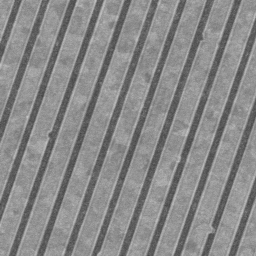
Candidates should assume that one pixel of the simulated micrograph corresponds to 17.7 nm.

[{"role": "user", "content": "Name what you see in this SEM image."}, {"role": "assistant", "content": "parallel lines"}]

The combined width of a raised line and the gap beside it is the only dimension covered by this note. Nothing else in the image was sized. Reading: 458 nm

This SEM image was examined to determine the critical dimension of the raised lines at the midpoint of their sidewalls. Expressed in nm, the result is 309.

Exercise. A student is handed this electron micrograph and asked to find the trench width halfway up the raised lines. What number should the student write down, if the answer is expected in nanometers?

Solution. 154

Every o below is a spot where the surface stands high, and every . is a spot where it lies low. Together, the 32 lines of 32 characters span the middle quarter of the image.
oo...oooo..ooooo..ooooo..ooooo..
oo..ooooo..ooooo..ooooo..oooo...
oo..oooo...oooo...oooo..ooooo..o
o...oooo..ooooo..ooooo..ooooo..o
o..ooooo..ooooo..ooooo..oooo...o
o..oooo...oooo...oooo..ooooo..oo
...oooo..ooooo..ooooo..ooooo..oo
..ooooo..ooooo..ooooo..oooo...oo
..oooo...oooo...oooo..ooooo..ooo
..oooo..ooooo..ooooo..ooooo..ooo
.ooooo..ooooo..oooo...oooo...ooo
.oooo...oooo...oooo..ooooo..oooo
.oooo..ooooo..ooooo..ooooo..oooo
ooooo..ooooo..oooo...oooo...oooo
oooo...oooo...oooo..ooooo..ooooo
oooo..ooooo..ooooo..ooooo..oooo.
oooo..ooooo..oooo...oooo...oooo.
ooo...oooo...oooo..ooooo..ooooo.
ooo..ooooo..ooooo..ooooo..oooo..
ooo..ooooo..oooo...oooo...oooo..
oo...oooo...oooo..ooooo..ooooo..
oo..ooooo..ooooo..ooooo..oooo...
oo..oooo...oooo...oooo...oooo..o
o..ooooo..ooooo..ooooo..ooooo..o
o..ooooo..ooooo..ooooo..oooo...o
...oooo...oooo...oooo...oooo..oo
..ooooo..ooooo..ooooo..ooooo..oo
..ooooo..ooooo..oooo...oooo...oo
..oooo...oooo..ooooo..ooooo..ooo
.ooooo..ooooo..ooooo..ooooo..ooo
.ooooo..ooooo..oooo...oooo...ooo
.oooo...oooo..ooooo..ooooo..oooo